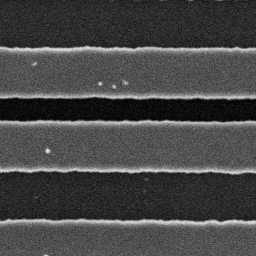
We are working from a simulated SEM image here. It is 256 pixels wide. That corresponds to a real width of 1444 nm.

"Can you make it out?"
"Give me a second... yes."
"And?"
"lines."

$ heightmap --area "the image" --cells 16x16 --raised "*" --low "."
................
................
................
****************
****************
****************
................
................
****************
****************
****************
................
................
................
****************
****************